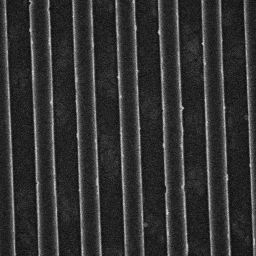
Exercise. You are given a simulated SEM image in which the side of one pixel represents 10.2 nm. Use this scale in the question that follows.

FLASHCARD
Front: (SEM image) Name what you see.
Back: parallel lines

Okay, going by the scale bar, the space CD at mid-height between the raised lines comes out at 239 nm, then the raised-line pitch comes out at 437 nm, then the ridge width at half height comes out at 19.7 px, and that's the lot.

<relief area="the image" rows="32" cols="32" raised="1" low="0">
10001100011100011000110001110001
10001100011100111000110001110001
10001100011100111000110001110001
10001100011100011000110001110001
10001100011100011000110001110001
10001100011100011000110001110001
10001100011100011000110001110001
10001100011100011000110000110001
10001100011100011000110000110001
10001100011100011000110000110001
10001100001100011000111000110001
10001110001100011000111000110001
10001110011100011000111000110001
10001110001100011000111000110001
10001110001100011000111000110001
10001110001100011000111000110001
10001110001100011100111000110001
10001110001100011000111000110001
10001110001100011000111000110001
11001110001100011100011000110001
11001110001100011100011000110001
11000110001100011100011000110001
11000110001100011100011000110001
11000110001100011100011000110001
11000110001100011100011000110001
11000110001100011100011000110001
11000110001100001100011000110000
11000110001100001100011000111000
11000110001110001100011000111000
11000110001110001100011000111000
11000110001110001100011000111000
11000110001110001100011000111000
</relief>